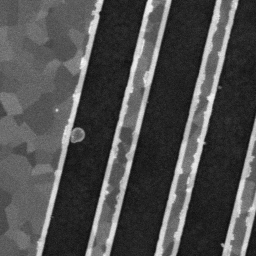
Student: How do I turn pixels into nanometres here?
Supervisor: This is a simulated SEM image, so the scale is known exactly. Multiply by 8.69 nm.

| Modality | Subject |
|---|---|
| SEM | one or a few lines or trenches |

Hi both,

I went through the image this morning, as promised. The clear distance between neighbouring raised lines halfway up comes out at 418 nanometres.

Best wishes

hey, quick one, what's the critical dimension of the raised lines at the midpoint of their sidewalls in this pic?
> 148 nanometers